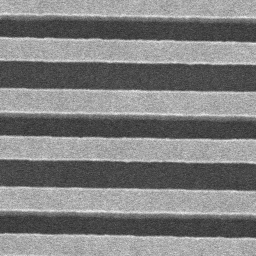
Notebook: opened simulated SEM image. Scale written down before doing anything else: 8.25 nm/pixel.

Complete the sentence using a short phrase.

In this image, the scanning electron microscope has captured lines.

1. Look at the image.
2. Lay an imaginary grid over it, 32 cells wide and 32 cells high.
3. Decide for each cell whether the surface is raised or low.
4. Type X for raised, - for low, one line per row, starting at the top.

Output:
XXXXXXXXXXXXXXXXXXXXXXXXXXXXXXXX
XXXXXXXXXXXXXXXXXXXXXXXXXXXXXXXX
--------------------------------
--------------------------------
--------------------------------
XXXXXXXXXXXXXXXXXXXXXXXXXXXXXXXX
XXXXXXXXXXXXXXXXXXXXXXXXXXXXXXXX
XXXXXXXXXXXXXXXXXXXXXXXXXXXXXXXX
--------------------------------
--------------------------------
--------------------------------
XXXXXXXXXXXXXXXXXXXXXXXXX-------
XXXXXXXXXXXXXXXXXXXXXXXXXXXXXXXX
XXXXXXXXXXXXXXXXXXXXXXXXXXXXXXXX
---------------------------X-XXX
--------------------------------
--------------------------------
XXXXXXXXXXXXXXXXXXXXXXXXXXX--XXX
XXXXXXXXXXXXXXXXXXXXXXXXXXXXXXXX
XXXXXXXXXXXXXXXXXXXXXXXXXXXXXXXX
--------------------------------
--------------------------------
--------------------------------
XXXX----------------------------
XXXXXXXXXXXXXXXXXXXXXXXXXXXXXXXX
XXXXXXXXXXXXXXXXXXXXXXXXXXXXXXXX
---------XXXXXXXXXXXXXXXXXXXXXXX
--------------------------------
--------------------------------
XXXXXXXXXXXX-X------------------
XXXXXXXXXXXXXXXXXXXXXXXXXXXXXXXX
XXXXXXXXXXXXXXXXXXXXXXXXXXXXXXXX